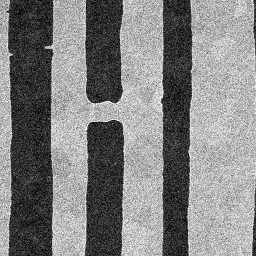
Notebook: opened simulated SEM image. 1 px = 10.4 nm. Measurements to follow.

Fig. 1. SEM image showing one or a few lines or trenches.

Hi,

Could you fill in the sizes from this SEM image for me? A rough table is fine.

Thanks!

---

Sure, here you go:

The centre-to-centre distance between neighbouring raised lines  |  782 nm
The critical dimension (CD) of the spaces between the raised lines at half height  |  383 nm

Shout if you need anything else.